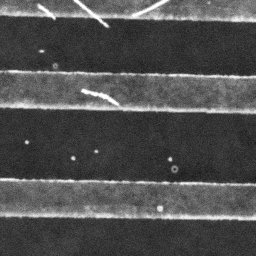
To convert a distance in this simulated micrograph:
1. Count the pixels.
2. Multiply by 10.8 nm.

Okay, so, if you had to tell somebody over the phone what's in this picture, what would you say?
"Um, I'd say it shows lines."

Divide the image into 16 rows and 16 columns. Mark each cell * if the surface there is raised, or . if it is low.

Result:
****************
................
................
................
***.............
****************
****************
................
................
................
................
**************..
****************
.........*******
................
................